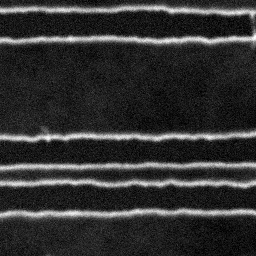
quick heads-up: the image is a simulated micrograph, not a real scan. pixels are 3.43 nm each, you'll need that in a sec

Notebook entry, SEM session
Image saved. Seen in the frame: lines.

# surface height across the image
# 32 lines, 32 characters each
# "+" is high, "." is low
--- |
++++++++++++++++++++++++++++++++
+....................+..++++++++
................................
................................
................................
++++++++++++++++++++++++++++++++
++++++++++++++++++++++++++++++++
++++++++++++++++++++++++++++++++
++++++++++++++++++++++++++++++++
++++++++++++++++++++++++++++++++
++++++++++++++++++++++++++++++++
++++++++++++++++++++++++++++++++
++++++++++++++++++++++++++++++++
++++++++++++++++++++++++++++++++
++++++++++++++++++++++++++++++++
++++++++++++++++++++++++++++++++
++++++++++++++++++++++++++++++++
................................
................................
................................
..................++....++++..++
++++++++++++++++++++++++++++++++
++++++++++++++++++++++++++++++++
................................
................................
................................
..+.............++++++++++++++++
++++++++++++++++++++++++++++++++
++++++++++++++++++++++++++++++++
++++++++++++++++++++++++++++++++
++++++++++++++++++++++++++++++++
++++++++++++++++++++++++++++++++